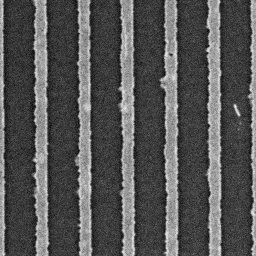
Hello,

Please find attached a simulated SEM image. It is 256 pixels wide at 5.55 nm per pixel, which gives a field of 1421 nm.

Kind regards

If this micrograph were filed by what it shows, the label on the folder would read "lines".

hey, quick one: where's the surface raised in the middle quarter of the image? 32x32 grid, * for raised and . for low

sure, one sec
....**........***........***....
....**........***........***....
....**........***.........**....
....**.........**........***....
....**........***.......****....
....**.........**.......****....
....**........***........***....
....**.........**.........**....
....**.........**........***....
....**........***........***....
....**........***........***....
....**........***........***....
....**.........**........***....
....**.........**........***....
....**.........**........***....
....**.........**........***....
....**.........**.........**....
....***........**.........**....
....**.........**........***....
....**.........**.........**....
....**.........**........***....
....**.........**........**.....
....***........**........***....
...****.......***........***....
...****.......***.........**....
....***........**........***....
....**.........**........***....
....***........**........***....
....***........**.........**....
....***........**.........**....
....**.........**.........**....
....***........**.........**....